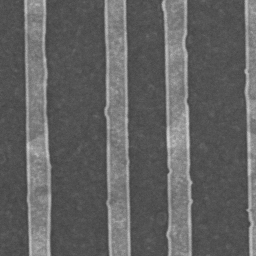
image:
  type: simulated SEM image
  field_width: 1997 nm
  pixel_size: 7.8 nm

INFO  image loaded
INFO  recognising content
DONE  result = one or a few lines or trenches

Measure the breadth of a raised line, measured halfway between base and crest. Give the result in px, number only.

19.3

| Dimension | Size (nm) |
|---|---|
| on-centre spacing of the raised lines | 548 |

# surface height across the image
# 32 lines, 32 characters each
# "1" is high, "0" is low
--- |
00011000000001110000111000000001
00011100000001110000011000000001
00011100000001110000011000000001
00011000000001110000011000000001
00011000000001110000011000000001
00011000000001110000011000000001
00011000000001110000011000000001
00011100000001110000011000000001
00011100000001110000011000000001
00011100000001110000011000000001
00011100000001110000011000000001
00011100000000110000011000000001
00011100000000110000011000000001
00011100000001110000011000000001
00011100000001110000011000000001
00011100000000110000011000000001
00011100000000110000011000000001
00011100000000110000011000000001
00001100000000110000011000000001
00001100000000110000011100000001
00001100000000110000011100000001
00001100000000110000011000000001
00001100000000110000011100000001
00001100000000110000011100000001
00001100000000110000011100000001
00001100000000110000011100000001
00001100000000110000011100000001
00001100000000110000011100000001
00001100000000110000011100000001
00001100000000110000011100000001
00001100000000110000011100000001
00001100000000110000011100000001